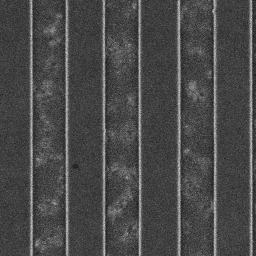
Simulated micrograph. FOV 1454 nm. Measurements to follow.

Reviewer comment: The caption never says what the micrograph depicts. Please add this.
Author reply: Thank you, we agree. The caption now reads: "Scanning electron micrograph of one or a few lines or trenches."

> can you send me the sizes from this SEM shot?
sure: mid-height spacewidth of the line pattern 200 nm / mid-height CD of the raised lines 0.215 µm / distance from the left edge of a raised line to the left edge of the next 419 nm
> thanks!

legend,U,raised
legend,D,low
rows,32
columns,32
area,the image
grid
UUUUDDDDUUUUUDDDDDUUUUDDDDDUUUUD
UUUUDDDDUUUUUDDDDDUUUUDDDDDUUUUD
UUUUDDDDUUUUUDDDDDUUUUDDDDDUUUUD
UUUUDDDDUUUUUDDDDDUUUUDDDDDUUUUD
UUUUDDDDUUUUUDDDDDUUUUDDDDDUUUUD
UUUUDDDDUUUUUDDDDDUUUUDDDDDUUUUD
UUUUDDDDUUUUUDDDDUUUUUDDDDDUUUUD
UUUUDDDDUUUUUDDDDUUUUUDDDDDUUUUD
UUUUDDDDUUUUUDDDDUUUUUDDDDDUUUUD
UUUUDDDDUUUUUDDDDUUUUUDDDDDUUUUD
UUUUDDDDUUUUUDDDDUUUUUDDDDDUUUUD
UUUUDDDDUUUUUDDDDDUUUUDDDDDUUUUD
UUUUDDDDUUUUUDDDDDUUUUDDDDDUUUUD
UUUUDDDDUUUUUDDDDUUUUUDDDDDUUUUD
UUUUDDDDUUUUUDDDDUUUUUDDDDDUUUUD
UUUUDDDDUUUUUDDDDDUUUUDDDDDUUUUD
UUUUDDDDUUUUUDDDDDUUUUDDDDDUUUUD
UUUUDDDDUUUUUDDDDDUUUUDDDDDUUUUD
UUUUDDDDUUUUUDDDDDUUUUDDDDDUUUUD
UUUUDDDDUUUUUDDDDDUUUUDDDDDUUUUD
UUUUDDDDUUUUUDDDDDUUUUDDDDDUUUUD
UUUUDDDDUUUUUDDDDDUUUUDDDDDUUUUD
UUUUDDDDUUUUUDDDDDUUUUDDDDDUUUUD
UUUUDDDDUUUUUDDDDDUUUUDDDDDUUUUD
UUUUDDDDUUUUUDDDDDUUUUDDDDDUUUUD
UUUUDDDDUUUUUDDDDDUUUUDDDDDUUUUD
UUUUDDDDUUUUUDDDDDUUUUDDDDDUUUUD
UUUUDDDDUUUUUDDDDDUUUUDDDDDUUUUD
UUUUDDDDUUUUUDDDDDUUUUDDDDDUUUUD
UUUUDDDDUUUUUDDDDDUUUUDDDDDUUUUD
UUUUDDDDUUUUUDDDDDUUUUDDDDDUUUUD
UUUUDDDDUUUUUDDDDDUUUUDDDDDUUUUD